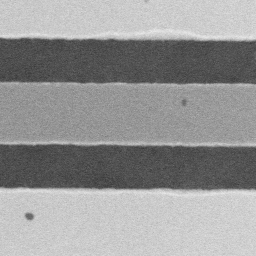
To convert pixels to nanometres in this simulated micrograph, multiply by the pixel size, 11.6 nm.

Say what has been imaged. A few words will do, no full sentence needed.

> lines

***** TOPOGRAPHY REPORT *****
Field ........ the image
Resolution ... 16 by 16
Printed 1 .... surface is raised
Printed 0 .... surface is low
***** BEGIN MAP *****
1111111111111111
1111111111111111
0000000000000000
0000000000000000
0000000000000000
1111111111111111
1111111111111111
1111111111111111
1111111111111111
0000000000000000
0000000000000000
0000000000000000
1111111111111111
1111111111111111
1111111111111111
1111111111111111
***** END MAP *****